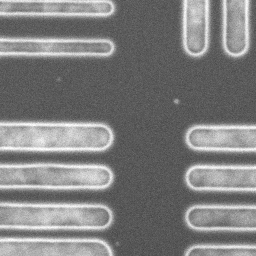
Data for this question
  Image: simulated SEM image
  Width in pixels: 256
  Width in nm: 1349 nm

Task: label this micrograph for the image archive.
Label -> groups of lines, slits or small figures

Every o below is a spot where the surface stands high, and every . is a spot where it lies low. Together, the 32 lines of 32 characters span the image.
..............ooooooooo...oo...o
..............ooooooooo...oo...o
ooooooooooooooooooooooo...oo...o
ooooooooooooooooooooooo...oo...o
ooooooooooooooooooooooo...oo...o
..............ooooooooo...oo...o
..............oooooooooo.oooo.oo
oooooooooooooooooooooooooooooooo
oooooooooooooooooooooooooooooooo
oooooooooooooooooooooooooooooooo
oooooooooooooooooooooooooooooooo
oooooooooooooooooooooooooooooooo
oooooooooooooooooooooooooooooooo
oooooooooooooooooooooooooooooooo
oooooooooooooooooooooooooooooooo
oooooooooooooooooooooooooooooooo
..............oooooooooo........
..............oooooooooo........
oooo........oooooooooooooo......
oooooooooooooooooooooooooooooooo
oooooooooooooooooooooooooooooooo
..............oooooooooo........
..............oooooooooo........
ooooooooooooooooooooooooo.......
oooooooooooooooooooooooooooooooo
oooooooooooooooooooooooooooooooo
..............oooooooooo........
..............oooooooooo........
ooooooooooooooooooooooooo.......
oooooooooooooooooooooooooooooooo
.............ooooooooooooooooooo
..............oooooooooo........